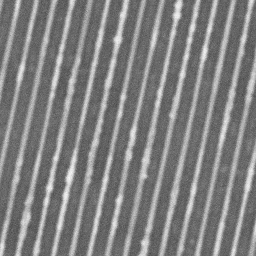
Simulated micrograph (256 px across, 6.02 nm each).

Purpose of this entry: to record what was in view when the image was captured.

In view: parallel lines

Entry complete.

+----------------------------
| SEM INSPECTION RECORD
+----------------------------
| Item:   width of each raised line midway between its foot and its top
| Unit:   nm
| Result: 22.8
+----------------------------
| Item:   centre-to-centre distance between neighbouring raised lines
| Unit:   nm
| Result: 106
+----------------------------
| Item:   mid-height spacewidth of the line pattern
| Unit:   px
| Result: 14.2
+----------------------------